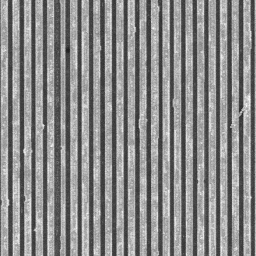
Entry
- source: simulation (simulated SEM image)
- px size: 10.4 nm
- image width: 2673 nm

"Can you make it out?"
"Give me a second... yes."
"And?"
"parallel lines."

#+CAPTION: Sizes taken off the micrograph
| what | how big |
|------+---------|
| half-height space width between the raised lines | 0.0496 microns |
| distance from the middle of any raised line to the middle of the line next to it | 120 nm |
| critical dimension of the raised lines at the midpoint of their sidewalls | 69.1 nanometers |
